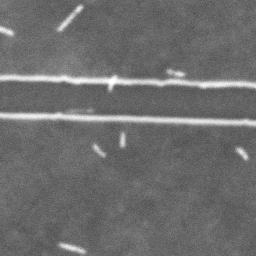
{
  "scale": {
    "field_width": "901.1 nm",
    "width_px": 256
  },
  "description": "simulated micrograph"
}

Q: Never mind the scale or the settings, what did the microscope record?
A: one or a few lines or trenches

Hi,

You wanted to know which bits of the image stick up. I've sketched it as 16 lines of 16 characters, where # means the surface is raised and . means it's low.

################
################
################
################
################
................
................
###########.....
################
################
################
################
################
################
################
################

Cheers